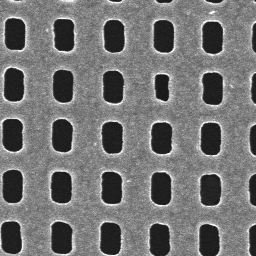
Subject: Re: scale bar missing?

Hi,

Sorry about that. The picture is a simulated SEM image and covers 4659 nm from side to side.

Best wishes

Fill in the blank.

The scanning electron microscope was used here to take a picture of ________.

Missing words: a regular array of holes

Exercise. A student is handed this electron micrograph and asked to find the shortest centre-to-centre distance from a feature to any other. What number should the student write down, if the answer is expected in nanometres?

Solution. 895